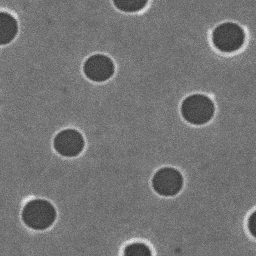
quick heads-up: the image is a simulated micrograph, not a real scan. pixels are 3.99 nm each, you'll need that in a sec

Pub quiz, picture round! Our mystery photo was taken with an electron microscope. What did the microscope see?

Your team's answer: holes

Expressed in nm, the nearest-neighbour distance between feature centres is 312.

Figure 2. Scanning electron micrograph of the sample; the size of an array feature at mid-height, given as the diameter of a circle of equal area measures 129 nm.